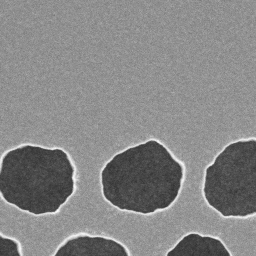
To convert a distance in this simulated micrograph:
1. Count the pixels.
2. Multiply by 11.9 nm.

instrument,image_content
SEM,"holes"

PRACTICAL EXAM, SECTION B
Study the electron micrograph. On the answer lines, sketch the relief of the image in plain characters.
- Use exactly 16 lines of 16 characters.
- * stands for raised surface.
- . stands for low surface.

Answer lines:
****************
****************
****************
****************
****************
****************
****************
****************
****************
*...****...***..
.....**....**...
.....*.....**...
....***....**...
****************
****************
.***....***...**